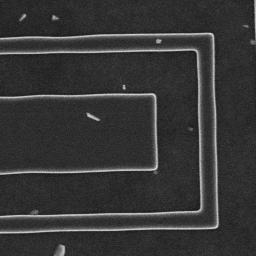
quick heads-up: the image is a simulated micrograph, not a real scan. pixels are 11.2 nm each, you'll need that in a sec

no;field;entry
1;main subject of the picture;groups of lines, slits or small figures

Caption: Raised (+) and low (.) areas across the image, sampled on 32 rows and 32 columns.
................................
................................
................................
................................
..........+++++++++++++++++.....
+++++++++++++++++++++++++++.....
++++++++++++............+++.....
.........................++.....
.........................++.....
.........................++.....
.........................++.....
.........................++.....
+++++++++++++++++++......++.....
+++++++++++++++++++......++.....
+++++++++++++++++++......++.....
+++++++++++++++++++......++.....
+++++++++++++++++++......++.....
++++++++++++++++++++.....++.....
++++++++++++++++++++.....++.....
++++++++++++++++++++.....++.....
++++++++++++++++++++.....++.....
++++.+++++...............++.....
.........................++.....
.........................++.....
.........................++.....
.........................++.....
......................+++++.....
+++++++++++++++++++++++++++.....
+++++++++++++++++++++++++++.....
................................
................................
................................